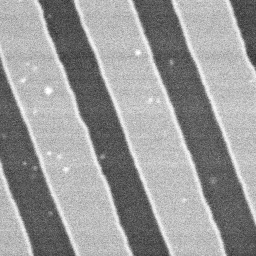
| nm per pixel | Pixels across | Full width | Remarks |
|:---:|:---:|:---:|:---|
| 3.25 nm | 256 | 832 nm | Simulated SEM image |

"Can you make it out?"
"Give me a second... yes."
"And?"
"lines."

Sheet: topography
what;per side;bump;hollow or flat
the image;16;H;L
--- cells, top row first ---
HHHLLHHHLLLHHHLL
HHHLLHHHHLLHHHHL
HHHLLLHHHLLLHHHL
HHHHLLHHHHLLHHHL
HHHHLLHHHHLLHHHH
LHHHLLLHHHLLLHHH
LHHHHLLHHHHLLHHH
LLHHHLLHHHHLLLHH
LLHHHHLLHHHLLLHH
LLHHHHLLHHHHLLHH
LLLHHHLLLHHHLLLH
LLLHHHHLLHHHHLLH
HLLHHHHLLHHHHLLH
HLLLHHHLLLHHHLLL
HHLLHHHHLLHHHHLL
HHLLLHHHLLHHHHLL